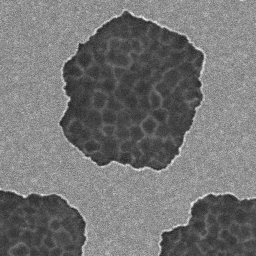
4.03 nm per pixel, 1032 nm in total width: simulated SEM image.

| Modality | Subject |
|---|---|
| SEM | holes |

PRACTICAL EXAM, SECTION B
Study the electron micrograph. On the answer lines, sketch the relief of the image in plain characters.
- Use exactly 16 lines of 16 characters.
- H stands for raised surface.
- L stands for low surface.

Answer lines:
HHHHHHHHHHHHHHHH
HHHHHHHLLLHHHHHH
HHHHHLLLLLLLHHHH
HHHHHLLLLLLLLHHH
HHHHLLLLLLLLLHHH
HHHHLLLLLLLLLHHH
HHHHLLLLLLLLHHHH
HHHHLLLLLLLLHHHH
HHHHLLLLLLLLHHHH
HHHHHLLLLLLHHHHH
HHHHHHHHHLHHHHHH
HHHHHHHHHHHHHHHH
LLLLHHHHHHHHLLLL
LLLLLHHHHHHHLLLL
LLLLLHHHHHLLLLLL
LLLLLHHHHHLLLLLL